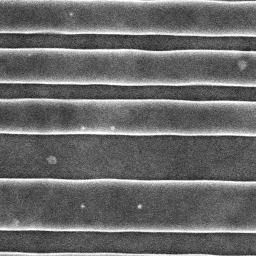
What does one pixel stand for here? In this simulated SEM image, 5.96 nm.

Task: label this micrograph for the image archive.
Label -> groups of lines, slits or small figures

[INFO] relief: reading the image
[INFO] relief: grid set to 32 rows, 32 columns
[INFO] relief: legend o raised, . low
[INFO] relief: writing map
oooooooooooooooooooooooooooooooo
oooooooooooooooooooooooooooooooo
oooooooooooooooooooooooooooooooo
oooooooooooooooooooooooooooooooo
................................
................................
ooooooooooooooooooo..oooooooooo.
oooooooooooooooooooooooooooooooo
oooooooooooooooooooooooooooooooo
oooooooooooooooooooooooooooooooo
...............ooo..ooo....ooooo
................................
oooooooo........................
oooooooooooooooooooooooooooooooo
oooooooooooooooooooooooooooooooo
oooooooooooooooooooooooooooooooo
oooooooooooooooooooooooooooooooo
................................
................................
................................
................................
................................
oooooooo...ooooo................
oooooooooooooooooooooooooooooooo
oooooooooooooooooooooooooooooooo
oooooooooooooooooooooooooooooooo
oooooooooooooooooooooooooooooooo
oooooooooooooooooooooooooooooooo
oooooooooooooooooooooooooooooooo
................................
................................
................................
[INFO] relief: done